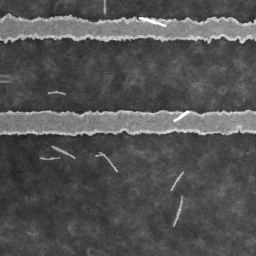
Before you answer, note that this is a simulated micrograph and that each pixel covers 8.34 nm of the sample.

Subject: one or a few lines or trenches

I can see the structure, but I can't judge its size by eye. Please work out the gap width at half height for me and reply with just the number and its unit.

607 nanometres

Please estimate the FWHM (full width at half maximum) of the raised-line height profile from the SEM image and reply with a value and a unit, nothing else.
0.169 um